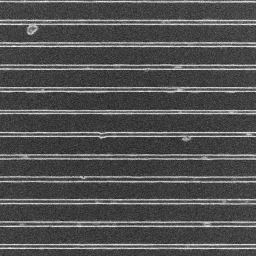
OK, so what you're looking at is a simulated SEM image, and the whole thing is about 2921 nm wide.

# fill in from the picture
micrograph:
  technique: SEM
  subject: parallel lines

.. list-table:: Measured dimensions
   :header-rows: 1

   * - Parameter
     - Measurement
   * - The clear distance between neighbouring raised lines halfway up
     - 0.203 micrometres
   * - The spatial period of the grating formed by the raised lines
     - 256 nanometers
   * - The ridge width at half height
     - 54.2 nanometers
